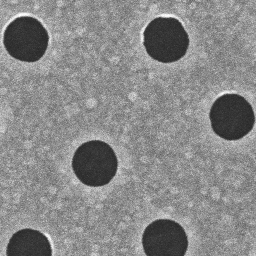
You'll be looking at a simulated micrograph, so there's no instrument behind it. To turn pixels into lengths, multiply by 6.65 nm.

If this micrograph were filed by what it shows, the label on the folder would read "holes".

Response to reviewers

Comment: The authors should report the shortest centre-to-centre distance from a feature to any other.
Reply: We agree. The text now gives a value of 802 nanometers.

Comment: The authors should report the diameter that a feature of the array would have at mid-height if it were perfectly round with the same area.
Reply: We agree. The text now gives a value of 309 nm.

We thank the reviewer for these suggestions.